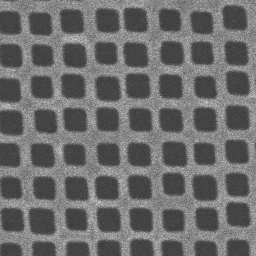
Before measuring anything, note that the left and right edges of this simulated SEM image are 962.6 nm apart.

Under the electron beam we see a regular array of holes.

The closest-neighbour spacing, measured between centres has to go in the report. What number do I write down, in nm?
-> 116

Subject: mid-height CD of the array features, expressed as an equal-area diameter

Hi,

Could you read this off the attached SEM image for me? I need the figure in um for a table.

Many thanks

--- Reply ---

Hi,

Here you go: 0.0973